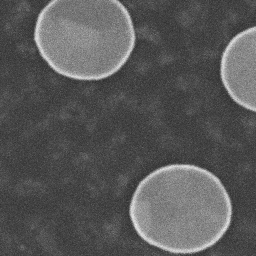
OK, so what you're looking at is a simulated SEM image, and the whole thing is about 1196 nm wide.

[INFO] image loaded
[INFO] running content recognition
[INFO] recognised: raised bodies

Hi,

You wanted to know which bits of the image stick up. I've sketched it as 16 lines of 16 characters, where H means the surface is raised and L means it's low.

LLLHHHHHLLLLLLLL
LLHHHHHHLLLLLLLL
LLHHHHHHLLLLLLLH
LLLHHHHHLLLLLLHH
LLLLHHHLLLLLLLHH
LLLLLLLLLLLLLLHH
LLLLLLLLLLLLLLLH
LLLLLLLLLLLLLLLL
LLLLLLLLLLLLLLLL
LLLLLLLLLLLLLLLL
LLLLLLLLLLHHLLLL
LLLLLLLLLHHHHHLL
LLLLLLLLHHHHHHLL
LLLLLLLLHHHHHHLL
LLLLLLLLLHHHHHLL
LLLLLLLLLLHHHLLL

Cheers